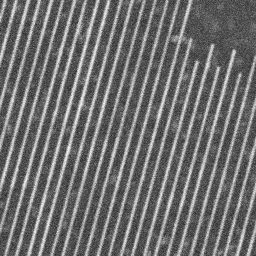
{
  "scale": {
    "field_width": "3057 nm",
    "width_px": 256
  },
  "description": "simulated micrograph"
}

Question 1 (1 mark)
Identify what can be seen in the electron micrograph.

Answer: parallel lines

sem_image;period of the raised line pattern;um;0.134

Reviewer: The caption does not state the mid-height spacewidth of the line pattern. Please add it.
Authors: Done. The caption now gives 111 nm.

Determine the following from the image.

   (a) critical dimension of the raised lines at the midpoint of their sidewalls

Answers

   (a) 23 nm